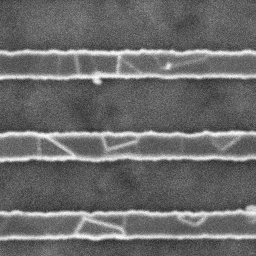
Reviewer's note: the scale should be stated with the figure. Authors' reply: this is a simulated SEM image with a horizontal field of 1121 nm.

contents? lines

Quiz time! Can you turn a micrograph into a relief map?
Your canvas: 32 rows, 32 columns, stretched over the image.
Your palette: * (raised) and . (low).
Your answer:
................................
................................
................................
................................
................................
................................
*.********************.*****..**
********************************
********************************
********************************
................................
................................
................................
................................
................................
................................
................................
********************************
********************************
********************************
................................
................................
................................
................................
................................
................................
................**..........***.
********************************
********************************
********************************
................................
................................